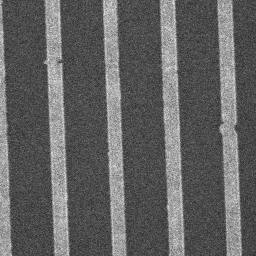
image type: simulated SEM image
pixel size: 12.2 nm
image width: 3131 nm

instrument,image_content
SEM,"parallel lines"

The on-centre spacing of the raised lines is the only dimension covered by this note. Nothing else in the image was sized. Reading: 703 nanometers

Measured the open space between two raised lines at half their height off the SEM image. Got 0.542 µm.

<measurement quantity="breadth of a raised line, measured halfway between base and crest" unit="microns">0.156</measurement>